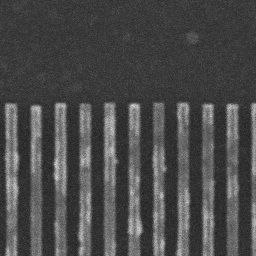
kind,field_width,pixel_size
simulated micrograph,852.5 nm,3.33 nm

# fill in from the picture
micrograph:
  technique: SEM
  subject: parallel lines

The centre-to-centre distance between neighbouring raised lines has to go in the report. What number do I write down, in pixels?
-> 24.5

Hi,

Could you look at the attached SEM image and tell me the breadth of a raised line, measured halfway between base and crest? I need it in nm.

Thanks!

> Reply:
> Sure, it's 34.9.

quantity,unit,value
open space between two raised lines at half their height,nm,49.1